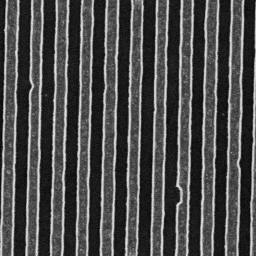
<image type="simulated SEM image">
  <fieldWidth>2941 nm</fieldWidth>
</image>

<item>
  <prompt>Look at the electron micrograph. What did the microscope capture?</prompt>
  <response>parallel lines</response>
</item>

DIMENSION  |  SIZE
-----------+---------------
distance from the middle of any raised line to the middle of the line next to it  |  25 pixels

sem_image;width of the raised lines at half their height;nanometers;125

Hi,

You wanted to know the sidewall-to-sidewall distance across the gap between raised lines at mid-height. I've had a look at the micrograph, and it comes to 156 nanometres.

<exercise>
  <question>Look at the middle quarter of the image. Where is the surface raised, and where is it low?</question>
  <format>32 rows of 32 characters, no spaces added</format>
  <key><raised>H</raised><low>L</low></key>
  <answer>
LLLLHHHLLLHHHLLLLHHLLLLHHHLLLHHH
LLLLHHHLLLHHHLLLLHHLLLLHHHLLLHHH
LLLLHHHLLLHHHLLLLHHLLLLHHHLLLHHH
LLLLHHHLLLHHHLLLLHHLLLLHHHLLLHHH
HLLLHHHLLLHHHLLLLHHLLLLHHHLLLHHH
HLLLHHHLLLLHHLLLHHHLLLLHHLLLLHHH
HLLLHHHLLLHHHLLLHHHLLLLHHLLLLHHH
HLLLHHHLLLHHHLLLLHHLLLLHHLLLLHHH
LLLLHHHLLLHHHLLLLHHLLLLHHLLLLHHH
LLLLHHHLLLHHHLLLLHHLLLLHHLLLLHHH
LLLLHHHLLLHHHLLLHHHLLLLHHLLLLHHL
LLLLHHHLLLHHHLLLLHHLLLLHHLLLLHHH
LLLLHHHLLLHHHLLLLHHLLLLHHLLLLHHH
LLLLHHHLLLHHHLLLHHHLLLLHHLLLLHHL
LLLLHHHLLLHHHLLLHHHLLLLHHLLLLHHL
LLLLHHLLLLHHHLLLHHHLLLLHHLLLLHHL
LLLLHHLLLLHHHLLLHHHLLLLHHLLLLHHL
LLLLHHLLLLHHHLLLHHHLLLLHHLLLLHHH
LLLLHHLLLLHHHLLLHHHLLLHHHLLLLHHH
LLLLHHLLLLHHHLLLHHHLLLLHHLLLLHHH
LLLLHHLLLLHHHLLLHHHLLLLHHLLLLHHL
LLLLHHLLLLHHHLLLHHHLLLHHHLLLLHHL
LLLLHHLLLLHHHLLLHHHLLLHHHLLLLHHL
LLLLHHLLLLHHHLLLHHHLLLHHHLLLLHHL
LLLLHHLLLLHHHLLLHHHLLLHHHLLLLHHL
LLLLHHLLLLHHHLLLHHHLLLHHHLLLLHHL
LLLLHHLLLLHHLLLLHHHLLLHHHLLLLHHL
LLLLHHLLLLHHLLLLHHHLLLHHHLLLLHHL
LLLHHHLLLLHHHLLLHHHLLLHHHLLLLHHL
LLLHHHLLLLHHLLLLHHHLLLHHHLLLLHHL
LLLHHHLLLLHHLLLLHHHLLLHHHLLLLHHL
LLLHHHLLLLHHLLLLHHHLLLHHHLLLLHHL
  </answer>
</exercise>